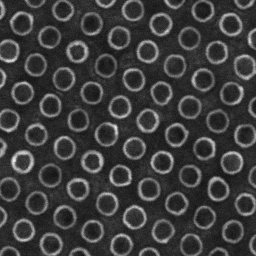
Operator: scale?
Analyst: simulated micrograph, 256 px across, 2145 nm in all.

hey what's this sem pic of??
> a regular array of raised bodies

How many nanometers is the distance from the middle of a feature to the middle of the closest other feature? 256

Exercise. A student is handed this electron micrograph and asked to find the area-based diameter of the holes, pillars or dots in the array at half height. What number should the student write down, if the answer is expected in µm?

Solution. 0.181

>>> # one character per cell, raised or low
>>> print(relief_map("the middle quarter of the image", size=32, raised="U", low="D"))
DDDDDDDDUUUUUDDDDDDDDDDDDUUUUUDD
UDDDDDDDUUUUUDDDUUUDDDDDDUUUUUDD
UUDDDDDDDUUUDDDUUUUUDDDDDDUUUDDD
UUUDDDDDDDDDDDDUUUUUDDDDDDDDDDDD
UUDDDDDDDDDDDDDUUUUUDDDDDDDDDDDD
UUDDDUUUUDDDDDDDUUUUDDUUUUDDDDDD
DDDDDUUUUUDDDDDDDUDDDDUUUUUDDDDD
DDDDDUUUUUDDDDDDDDDDDDUUUUUDDDDD
DDDDDUUUUDDDDUUDDDDDDDUUUUDDDDUU
DDDDDDUUUDDDUUUUDDDDDDDUUUDDDUUU
DDDDDDDDDDDDUUUUDDDDDDDDDDDDDUUU
DDDUDDDDDDDDUUUUDDDDDUDDDDDDDUUU
DDUUUDDDDDDDUUUUDDDUUUUDDDDDDDUU
DUUUUUDDDDDDDDDDDDDUUUUDDDDDDDDD
DUUUUUDDDDDDDDDDDDUUUUUDDDDDDDDD
DDUUUUDDDUUUUDDDDDDUUUUDDDDUUUDD
DDDUDDDDUUUUUDDDDDDDUUDDDDUUUUUD
DDDDDDDDUUUUUDDDDDDDDDDDDDUUUUUD
UDDDDDDDUUUUUDDDDDDDDDDDDDUUUUUD
UUDDDDDDDUUUUDDDUUUUDDDDDDUUUUDD
UUUDDDDDDDDDDDDUUUUUDDDDDDDDDDDD
UUUDDDDDDDDDDDDUUUUUDDDDDDDDDDDD
UUDDDDUUUDDDDDDUUUUUDDDUUUDDDDDD
UDDDDUUUUDDDDDDDDUDDDDUUUUUDDDDD
DDDDDUUUUUDDDDDDDDDDDDUUUUUDDDDD
DDDDDUUUUDDDDUDDDDDDDDUUUUUDDDDD
DDDDDDUUUDDDUUUUDDDDDDDUUUUDDUUU
DDDDDDDDDDDDUUUUDDDDDDDDDDDDDUUU
DDDDDDDDDDDUUUUUUDDDDDDDDDDDDUUU
DDUUUDDDDDDDUUUUUDDUUUUDDDDDDDUU
DUUUUUDDDDDDDDDDDDDUUUUUDDDDDDDU
DUUUUUDDDDDDDDDDDDDUUUUUDDDDDDDD